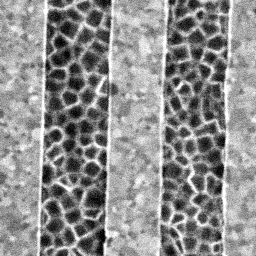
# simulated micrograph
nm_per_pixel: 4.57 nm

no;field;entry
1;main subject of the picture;one or a few lines or trenches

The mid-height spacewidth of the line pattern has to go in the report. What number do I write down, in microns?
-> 0.3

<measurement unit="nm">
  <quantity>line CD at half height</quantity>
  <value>240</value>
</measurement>